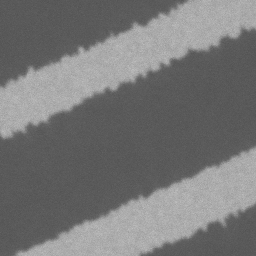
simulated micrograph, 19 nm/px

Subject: one or a few lines or trenches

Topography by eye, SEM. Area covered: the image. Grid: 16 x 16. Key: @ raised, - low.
-----------@@@@@
---------@@@@@@@
-------@@@@@@@--
----@@@@@@@-----
--@@@@@@@-------
@@@@@@@---------
@@@@@-----------
@@@-------------
----------------
---------------@
-------------@@@
-----------@@@@@
---------@@@@@@@
-------@@@@@@@--
----@@@@@@@@----
--@@@@@@@@------